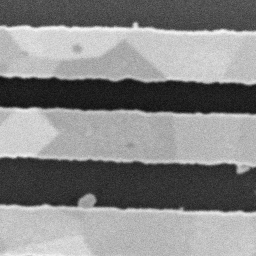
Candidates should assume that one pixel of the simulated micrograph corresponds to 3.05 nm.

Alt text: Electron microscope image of lines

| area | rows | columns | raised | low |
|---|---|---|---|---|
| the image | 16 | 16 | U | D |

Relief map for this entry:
DDDDDDDDDDDDDDDD
DDDDDDDDDDDDDDDD
UUUUUUUUUUUUUUUU
UUUUUUUUUUUUUUUU
UUUUUUUUUUUUUUUU
DDDDDDDDDDDDDDDD
DDDDDDDDDDDDDDDD
UUUUUUUUUUUUUUUU
UUUUUUUUUUUUUUUU
UUUUUUUUUUUUUUUU
DDDDDDDDDDDDDDDD
DDDDDDDDDDDDDDDD
DDDDDDDDDDDDDDDD
UUUUUUUUUUUUUUUU
UUUUUUUUUUUUUUUU
UUUUUUUUUUUUUUUU